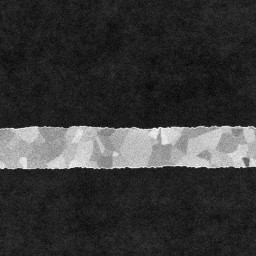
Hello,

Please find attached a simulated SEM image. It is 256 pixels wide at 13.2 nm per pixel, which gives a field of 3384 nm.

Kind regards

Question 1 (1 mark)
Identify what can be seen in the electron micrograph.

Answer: one or a few lines or trenches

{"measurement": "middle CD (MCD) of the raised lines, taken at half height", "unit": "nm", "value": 529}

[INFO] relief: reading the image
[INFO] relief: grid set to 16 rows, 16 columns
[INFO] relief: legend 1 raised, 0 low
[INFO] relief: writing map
0000000000000000
0000000000000000
0000000000000000
0000000000000000
0000000000000000
0000000000000000
0000000000000000
0000000000000000
1111111111111111
1111111111111111
1111001000000000
0000000000000000
0000000000000000
0000000000000000
0000000000000000
0000000000000000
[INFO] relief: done